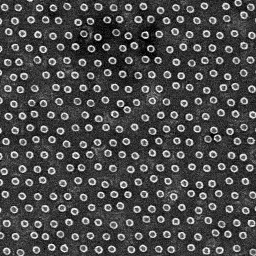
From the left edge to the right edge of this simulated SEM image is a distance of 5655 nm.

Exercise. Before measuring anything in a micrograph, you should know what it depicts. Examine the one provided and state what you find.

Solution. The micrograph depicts a regular array of raised bodies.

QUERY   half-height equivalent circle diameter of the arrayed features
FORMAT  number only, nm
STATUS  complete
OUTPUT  152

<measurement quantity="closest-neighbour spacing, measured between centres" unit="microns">0.29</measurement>